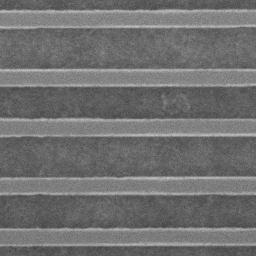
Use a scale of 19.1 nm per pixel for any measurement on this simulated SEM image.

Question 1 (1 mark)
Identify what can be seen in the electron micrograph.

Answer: lines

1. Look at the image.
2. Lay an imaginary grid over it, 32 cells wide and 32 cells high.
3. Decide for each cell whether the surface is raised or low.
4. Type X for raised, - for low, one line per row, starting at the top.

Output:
--------------------------------
XXXXXXXXXXXXXXXXXXXXXXXXXXXXXXXX
XXXXXXXXXXXXXXXXXXXXXXXXXXXXXXXX
XXXX----------------------------
--------------------------------
--------------------------------
--------------------------------
--------------------------------
--------------------------------
XXXXXXXXXXXXXXXXXXXXXXXXXXXXXXXX
XXXXXXXXXXXXXXXXXXXXXXXXXXXXXXXX
--------------------------------
--------------------------------
--------------------------------
--------------------------------
XXXXXXXXXXXXXXXXXXXXXXXXXXXXXXXX
XXXXXXXXXXXXXXXXXXXXXXXXXXXXXXXX
--------------------------------
--------------------------------
--------------------------------
--------------------------------
--------------------------------
XXXXXXXXXXXXXXXXXXXXXXXXXXXXXXXX
XXXXXXXXXXXXXXXXXXXXXXXXXXXXXXXX
--------------------------------
--------------------------------
--------------------------------
--------------------------------
--------------------------------
XXXXXXXXXXXXXXXXXXXXXXXXXXXXXXXX
XXXXXXXXXXXXXXXXXXXXXXXXXXXXXXXX
--------------------------------